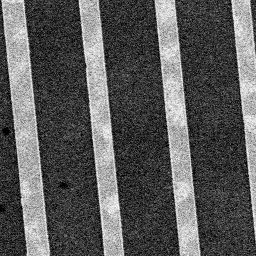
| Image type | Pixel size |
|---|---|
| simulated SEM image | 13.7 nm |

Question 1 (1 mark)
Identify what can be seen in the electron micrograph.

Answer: one or a few lines or trenches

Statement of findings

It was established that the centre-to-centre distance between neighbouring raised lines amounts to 1030 nanometers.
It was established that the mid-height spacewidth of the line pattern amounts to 56.7 px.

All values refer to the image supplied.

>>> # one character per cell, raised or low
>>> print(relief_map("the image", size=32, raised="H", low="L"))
HHHLLLLLLLHHLLLLLLLHHHLLLLLLLHHL
HHHLLLLLLLHHLLLLLLLLHHLLLLLLLHHL
HHHLLLLLLLHHHLLLLLLLHHLLLLLLLHHL
LHHLLLLLLLHHHLLLLLLLHHLLLLLLLHHL
LHHLLLLLLLHHHLLLLLLLHHLLLLLLLHHH
LHHHLLLLLLLHHLLLLLLLHHLLLLLLLLHH
LHHHLLLLLLLHHLLLLLLLHHLLLLLLLLHH
LHHHLLLLLLLHHLLLLLLLHHHLLLLLLLHH
LHHHLLLLLLLHHLLLLLLLHHHLLLLLLLHH
LHHHLLLLLLLHHLLLLLLLHHHLLLLLLLHH
LHHHLLLLLLLHHLLLLLLLHHHLLLLLLLHH
LHHHLLLLLLLHHLLLLLLLLHHLLLLLLLHH
LHHHLLLLLLLHHHLLLLLLLHHLLLLLLLHH
LLHHLLLLLLLHHHLLLLLLLHHLLLLLLLHH
LLHHLLLLLLLHHHLLLLLLLHHLLLLLLLHH
LLHHHLLLLLLLHHLLLLLLLHHLLLLLLLLH
LLHHHLLLLLLLHHLLLLLLLHHLLLLLLLLH
LLHHHLLLLLLLHHLLLLLLLHHHLLLLLLLH
LLHHHLLLLLLLHHLLLLLLLHHHLLLLLLLH
LLHHHLLLLLLLHHLLLLLLLHHHLLLLLLLH
LLHHHLLLLLLLHHLLLLLLLHHHLLLLLLLH
LLHHHLLLLLLLHHLLLLLLLLHHLLLLLLLH
LLHHHLLLLLLLHHHLLLLLLLHHLLLLLLLH
LLLHHLLLLLLLHHHLLLLLLLHHLLLLLLLH
LLLHHLLLLLLLHHHLLLLLLLHHLLLLLLLH
LLLHHHLLLLLLLHHLLLLLLLHHLLLLLLLL
LLLHHHLLLLLLLHHLLLLLLLHHLLLLLLLL
LLLHHHLLLLLLLHHLLLLLLLHHHLLLLLLL
LLLHHHLLLLLLLHHLLLLLLLHHHLLLLLLL
LLLHHHLLLLLLLHHLLLLLLLHHHLLLLLLL
LLLHHHLLLLLLLHHLLLLLLLLHHLLLLLLL
LLLHHHLLLLLLLHHLLLLLLLLHHLLLLLLL